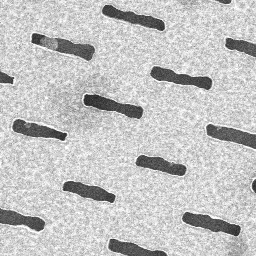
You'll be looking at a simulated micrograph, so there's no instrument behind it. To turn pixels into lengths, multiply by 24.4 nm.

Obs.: a regular array of holes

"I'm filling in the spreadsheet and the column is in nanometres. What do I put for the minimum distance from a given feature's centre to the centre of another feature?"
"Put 1830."